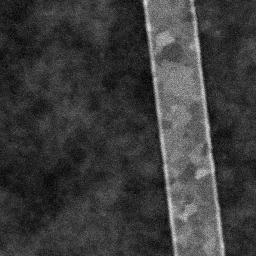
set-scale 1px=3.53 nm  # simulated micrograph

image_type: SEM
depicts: one or a few lines or trenches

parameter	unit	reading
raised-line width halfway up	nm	167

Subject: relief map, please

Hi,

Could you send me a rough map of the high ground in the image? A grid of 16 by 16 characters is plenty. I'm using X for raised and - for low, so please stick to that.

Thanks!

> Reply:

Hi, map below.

---------XXX----
---------XXX----
---------XXX----
---------XXX----
----------XXX---
----------XXX---
----------XXX---
----------XXX---
----------XXX---
----------XXX---
----------XXX---
----------XXX---
-----------XXX--
-----------XXX--
-----------XXX--
-----------XXX--